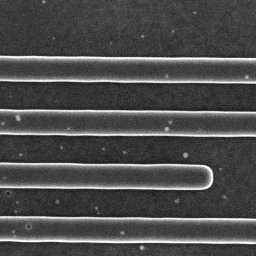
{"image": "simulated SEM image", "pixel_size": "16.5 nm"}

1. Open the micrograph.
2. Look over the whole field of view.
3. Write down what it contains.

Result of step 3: groups of lines, slits or small figures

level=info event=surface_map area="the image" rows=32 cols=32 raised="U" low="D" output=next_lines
DDDDDDDDDDDDDDDDDDDDDDDDDDDDDDDD
DDDDDDDDDDDDDDDDDDDDDDDDDDDDDDDD
DDDDDDDDDDDDDDDDDDDDDDDDDDDDDDDD
DDDDDDDDDDDDDDDDDDDDDDDDDDDDDDDD
DDDDDDDDDDDDDDDDDDDDDDDDDDDDDDDD
DDDDDDDDDDDDDDDDDDDDDDDDDDDDDDDD
DDDDDDDDDDDDDDDDDDDDDDDDDDDDDDDD
UUUUUUUUUUUUUUUUUUUUUUUUUUUUUUUU
UUUUUUUUUUUUUUUUUUUUUUUUUUUUUUUU
UUUUUUUUUUUUUUUUUUUUUUUUUUUUUUUU
DDDDDDDDDDDDDDDDDDDDDDDDDDDDDDDD
DDDDDDDDDDDDDDDDDDDDDDDDDDDDDDDD
DDDDDDDDDDDDDDDDDDDDDDDDDDDDDDDD
DDDDDDDDDDDDDDDDDDDDDDDDDDDDDDDD
UUUUUUUUUUUUUUUUUUUUUUUUUUUUUUUU
UUUUUUUUUUUUUUUUUUUUUUUUUUUUUUUU
UUUUUUUUUUUUUUUUUUUUUUUUUUUUUUUU
DDDDDDDDDDDDDDDDDDDDDDDDDDDDDDDD
DDDDDDDDDDDDDDDDDDDDDDDDDDDDDDDD
DDDDDDDDDDDDDDDDDDDDDDDDDDDDDDDD
UDDDDDDDDDDDDDDDDDDDDDDDDDDDDDDD
UUUUUUUUUUUUUUUUUUUUUUUUUUDDDDDD
UUUUUUUUUUUUUUUUUUUUUUUUUUDDDDDD
DDDDDDDDDDDDUUUUUUUUUUUUUUDDDDDD
DDDDDDDDDDDDDDDDDDDDDDDDDDDDDDDD
DDDDDDDDDDDDDDDDDDDDDDDDDDDDDDDD
DDDDDDDDDDDDDDDDDDDDDDDDDDDDDDDD
UUUUUUUUUUUUUUUUUUUUUUUUUUUUUUUU
UUUUUUUUUUUUUUUUUUUUUUUUUUUUUUUU
UUUUUUUUUUUUUUUUUUUUUUUUUUUUUUUU
DDDDDDDDDDDDDDDDDDDDDDDDDDDDDDDD
DDDDDDDDDDDDDDDDDDDDDDDDDDDDDDDD